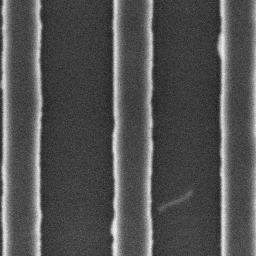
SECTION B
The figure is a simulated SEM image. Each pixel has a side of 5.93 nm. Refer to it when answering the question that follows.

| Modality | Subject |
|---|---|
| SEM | lines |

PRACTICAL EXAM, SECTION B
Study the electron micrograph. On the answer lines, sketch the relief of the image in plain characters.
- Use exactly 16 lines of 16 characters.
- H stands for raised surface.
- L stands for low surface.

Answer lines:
HHLLLLLHHLLLLLHH
HHHLLLLHHLLLLLHH
HHHLLLLHHLLLLLHH
HHLLLLLHHLLLLLHH
HHHLLLLHHLLLLLHH
HHHLLLLHHLLLLLHH
HHHLLLLHHLLLLLHH
HHHLLLLHHLLLLLHH
HHHLLLLHHLLLLLHH
HHLLLLLHHLLLLLHH
HHLLLLLHHLLLLLHH
HHLLLLLHHLLLLLHH
HHLLLLLHHLLLLLHH
HHHLLLLHHLLLLLHH
HHLLLLLHHLLLLLHH
HHHLLLLHHLLLLLHH